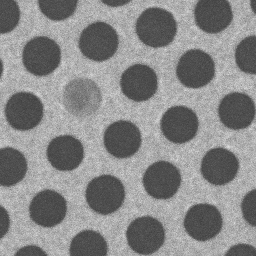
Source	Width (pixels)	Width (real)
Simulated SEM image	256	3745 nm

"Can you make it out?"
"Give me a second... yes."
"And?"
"a regular array of holes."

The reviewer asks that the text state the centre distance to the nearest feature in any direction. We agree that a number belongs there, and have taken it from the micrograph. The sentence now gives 842 nm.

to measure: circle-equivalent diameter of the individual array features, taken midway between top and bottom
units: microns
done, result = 0.567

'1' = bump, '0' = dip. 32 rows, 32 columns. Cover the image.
00111000001110001111111110000110
00011000011111111100011100000111
00111100111111111000001100000111
00111111111000111000001110001111
11111111110000011000001111111110
11100001110000011100011111111100
11100000110000111111111000111000
11100000111001111111110000011000
11100001111111110001110000011100
11111111111111100000110000011111
11111111111111100000111000111111
11111111110111100001111111111111
10000111100111110011111111110000
10000111100111111111100011100000
10000111111111111111000001100000
10000111111111000111000001110001
11111111111110000011000001111111
11111100001110000011100011111111
00111100001110000111111111101111
00011100001111001111111110000111
00011100001111111110001110000011
00011111111111111100001110000011
00011111111000011100000111000111
11111111111000001100001111111111
11110000111000001110001111111110
11110000111000011111111110111100
01110000111100111111111000011100
01110000111111111000111000001110
01111111111111110000111000001111
01111111100001110000011100011111
11111111100001110000111111111101
11000011100001111001111111110000